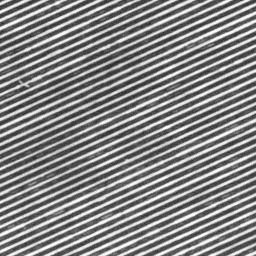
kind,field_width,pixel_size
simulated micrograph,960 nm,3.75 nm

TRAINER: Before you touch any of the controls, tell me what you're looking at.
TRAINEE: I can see parallel lines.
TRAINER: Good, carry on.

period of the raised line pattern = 28.2 nm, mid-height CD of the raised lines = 0.009 um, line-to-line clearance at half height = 21.4 nm